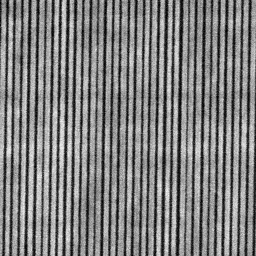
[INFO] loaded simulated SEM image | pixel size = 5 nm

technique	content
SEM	parallel lines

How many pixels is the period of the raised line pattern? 7.58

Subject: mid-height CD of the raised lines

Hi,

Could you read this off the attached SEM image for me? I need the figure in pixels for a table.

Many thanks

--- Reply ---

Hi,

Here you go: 4.24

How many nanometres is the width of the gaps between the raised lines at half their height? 16.9